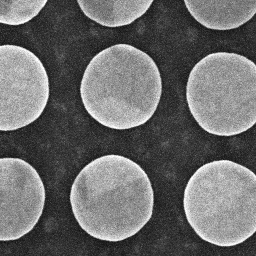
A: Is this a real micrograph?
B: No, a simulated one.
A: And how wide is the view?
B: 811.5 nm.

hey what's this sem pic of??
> raised bodies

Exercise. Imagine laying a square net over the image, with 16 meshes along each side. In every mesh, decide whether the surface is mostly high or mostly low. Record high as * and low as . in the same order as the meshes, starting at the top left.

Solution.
***..****...****
......**.....**.
................
**....***....**.
***..*****..****
***..*****..****
***..*****..****
**....***...****
................
................
**...****....**.
***..****...****
***.******..****
**...****...****
**...****...****
................